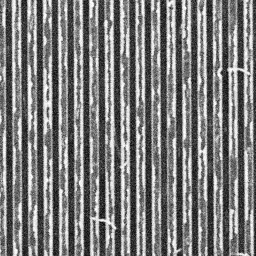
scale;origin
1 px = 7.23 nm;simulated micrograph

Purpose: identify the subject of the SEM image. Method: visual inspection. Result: parallel lines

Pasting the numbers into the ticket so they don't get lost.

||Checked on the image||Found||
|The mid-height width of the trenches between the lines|53.3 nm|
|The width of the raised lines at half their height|58.7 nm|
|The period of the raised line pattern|112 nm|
